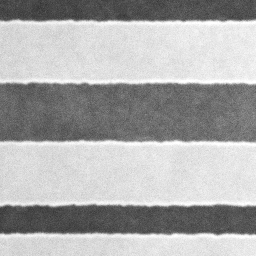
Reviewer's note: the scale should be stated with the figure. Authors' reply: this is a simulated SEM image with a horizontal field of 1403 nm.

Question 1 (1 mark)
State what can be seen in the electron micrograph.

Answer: lines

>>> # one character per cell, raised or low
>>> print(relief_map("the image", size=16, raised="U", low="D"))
DDDDDDDDDDDDDDDD
UUUUUUUUUUUUUUUU
UUUUUUUUUUUUUUUU
UUUUUUUUUUUUUUUU
UUUUUUUUUUUUUUUU
DDDDDDDDDDDDDDDD
DDDDDDDDDDDDDDDD
DDDDDDDDDDDDDDDD
DDDDDDDDDDDDDDDD
UUUUUUUUUUUUUUUU
UUUUUUUUUUUUUUUU
UUUUUUUUUUUUUUUU
UUUUUUUUUUUUUUUU
DDDDDDDDDDDDDDDD
DDDDDDDDDDDDDDDD
UUUUUUUUUUUUUUUU